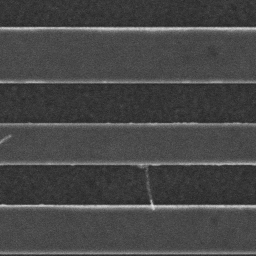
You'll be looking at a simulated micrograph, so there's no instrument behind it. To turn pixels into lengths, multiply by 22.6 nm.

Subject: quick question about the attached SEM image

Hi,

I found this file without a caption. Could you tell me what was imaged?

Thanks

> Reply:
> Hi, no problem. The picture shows lines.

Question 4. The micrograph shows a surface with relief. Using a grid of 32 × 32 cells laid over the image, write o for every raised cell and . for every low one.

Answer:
................................
................................
................................
oooooooooooooooooooooooooooooooo
oooooooooooooooooooooooooooooooo
oooooooooooooooooooooooooooooooo
oooooooooooooooooooooooooooooooo
oooooooooooooooooooooooooooooooo
oooooooooooooooooooooooooooooooo
oooooooooooooooooooooooooooooooo
................................
................................
................................
................................
................................
oooooooooooooooooooooooooooooooo
oooooooooooooooooooooooooooooooo
oooooooooooooooooooooooooooooooo
oooooooooooooooooooooooooooooooo
oooooooooooooooooooooooooooooooo
oooooooooooooooooooooooooooooooo
................................
................................
................................
................................
................................
oooooooooooooooooooooooooooooooo
oooooooooooooooooooooooooooooooo
oooooooooooooooooooooooooooooooo
oooooooooooooooooooooooooooooooo
oooooooooooooooooooooooooooooooo
oooooooooooooooooooooooooooooooo